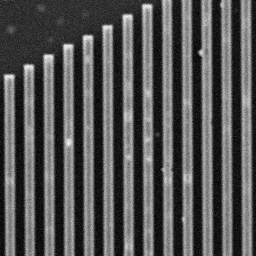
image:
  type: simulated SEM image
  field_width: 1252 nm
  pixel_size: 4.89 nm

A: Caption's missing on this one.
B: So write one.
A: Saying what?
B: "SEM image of parallel lines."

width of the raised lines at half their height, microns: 0.0415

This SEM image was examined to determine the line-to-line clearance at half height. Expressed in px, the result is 11.1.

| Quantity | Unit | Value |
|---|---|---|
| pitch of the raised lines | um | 0.0965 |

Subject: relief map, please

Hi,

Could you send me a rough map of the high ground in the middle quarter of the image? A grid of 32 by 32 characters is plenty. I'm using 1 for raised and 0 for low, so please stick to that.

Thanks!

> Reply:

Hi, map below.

11000110001100011000110001100011
11000110001100011000110001100011
11000110001100011000110001100011
11000110001100011000110001100011
11000110001100011000110001100011
11000110001100011000110001100011
11000110001100011000110001100011
11000110001100011000110001100011
11000110001100011000110001100011
11000110001100011000110001100011
11000110001100011000110001100011
11000110001100011000110001100011
11000110001100011000110001100011
11000110001100011000110001100011
11000110001100011000110001100011
11000110001100011000110001100011
11000110001100011000110001100011
11000110001100011000110001100011
11000110001100011000110001100011
11000110001100011000110001100011
11000110001100011000110001100011
11000110001100011000110001100011
11000110001100011000110001100011
11000110001100011000110001100011
11000110001100011000110001100011
11000110001100011000110001100011
11000110001100011000110001100011
11000110001100011000110001100011
11000110001100011000110001100011
11000110001100011000110001100011
11000110001100011000110001100011
11000110001100011000110001100011